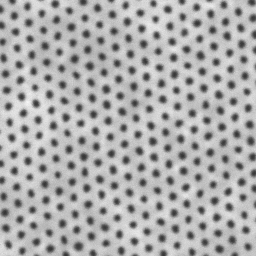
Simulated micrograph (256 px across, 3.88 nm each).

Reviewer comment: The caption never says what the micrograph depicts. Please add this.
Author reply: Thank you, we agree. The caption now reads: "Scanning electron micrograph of a regular array of holes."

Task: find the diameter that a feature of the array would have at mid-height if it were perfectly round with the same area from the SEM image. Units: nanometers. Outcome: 28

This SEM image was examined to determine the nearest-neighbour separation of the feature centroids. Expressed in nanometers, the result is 60.9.